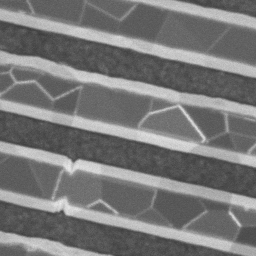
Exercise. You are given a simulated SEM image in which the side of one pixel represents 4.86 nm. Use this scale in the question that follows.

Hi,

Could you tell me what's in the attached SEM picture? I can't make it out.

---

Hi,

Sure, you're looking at one or a few lines or trenches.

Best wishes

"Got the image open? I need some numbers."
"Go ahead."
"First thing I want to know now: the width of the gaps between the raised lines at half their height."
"190 nm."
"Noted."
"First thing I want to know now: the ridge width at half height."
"237 nanometers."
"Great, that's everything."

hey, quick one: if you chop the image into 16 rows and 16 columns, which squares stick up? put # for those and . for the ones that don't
############....
..##############
.......#########
...........#####
####............
#########.......
##############..
....############
.........#######
##...........###
######..........
###########.....
.##############.
......##########
..........######
####..........##